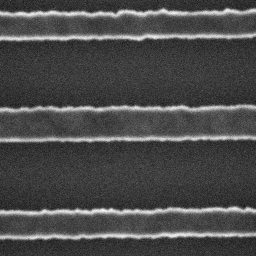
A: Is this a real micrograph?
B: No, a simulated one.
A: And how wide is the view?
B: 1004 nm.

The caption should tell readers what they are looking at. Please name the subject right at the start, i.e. lines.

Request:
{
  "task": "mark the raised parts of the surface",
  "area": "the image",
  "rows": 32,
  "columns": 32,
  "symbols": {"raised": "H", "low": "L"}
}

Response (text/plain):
LLLLLLLLLLLLLLLLLLLLLLLLLLLLLLLL
LLLLLLHLLLLLLLLHHLHHHLLLLHHHHHHH
HHHHHHHHHHHHHHHHHHHHHHHHHHHHHHHH
HHHHHHHHHHHHHHHHHHHHHHHHHHHHHHHH
HHHHHHHHHHHHHHHHHHHHHHHHHHHHHHHH
LLLLLLLLLLLLLLLLLLLLLLLLLLLLLLLL
LLLLLLLLLLLLLLLLLLLLLLLLLLLLLLLL
LLLLLLLLLLLLLLLLLLLLLLLLLLLLLLLL
LLLLLLLLLLLLLLLLLLLLLLLLLLLLLLLL
LLLLLLLLLLLLLLLLLLLLLLLLLLLLLLLL
LLLLLLLLLLLLLLLLLLLLLLLLLLLLLLLL
LLLLLLLLLLLLLLLLLLLLLLLLLLLLLLLL
LLLLLLLLLLLLLLLLLLLLLLLLLLLLLLLL
LLLLHHHLHLHHLHHHHHHHLHHHLHHHHHHH
HHHHHHHHHHHHHHHHHHHHHHHHHHHHHHHH
HHHHHHHHHHHHHHHHHHHHHHHHHHHHHHHH
HHHHHHHHHHHHHHHHHHHHHHHHHHHHHHHH
HHHHHHHHHHHHHHHHHHLLHHHLLLLLLLLL
LLLLLLLLLLLLLLLLLLLLLLLLLLLLLLLL
LLLLLLLLLLLLLLLLLLLLLLLLLLLLLLLL
LLLLLLLLLLLLLLLLLLLLLLLLLLLLLLLL
LLLLLLLLLLLLLLLLLLLLLLLLLLLLLLLL
LLLLLLLLLLLLLLLLLLLLLLLLLLLLLLLL
LLLLLLLLLLLLLLLLLLLLLLLLLLLLLLLL
LLLLLLLLLLLLLLLLLLLLLLLLLLLLLLLL
LLLLLLLLLLLLLLLLLLLLLLLLLLLLLLLL
HHHHLHHHHHHHHHHHHHHHHHHHHHHHHHHH
HHHHHHHHHHHHHHHHHHHHHHHHHHHHHHHH
HHHHHHHHHHHHHHHHHHHHHHHHHHHHHHHH
HHHHHHHHHHHHHHHHHHHHHHLHHHHHHHHL
LLLLLLLLLLLLLLLLLLLLLLLLLLLLLLLL
LLLLLLLLLLLLLLLLLLLLLLLLLLLLLLLL